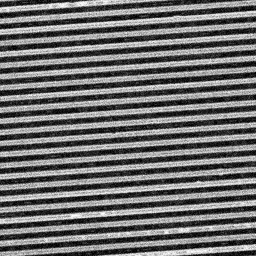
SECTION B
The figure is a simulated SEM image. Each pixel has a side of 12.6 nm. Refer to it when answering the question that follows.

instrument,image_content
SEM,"parallel lines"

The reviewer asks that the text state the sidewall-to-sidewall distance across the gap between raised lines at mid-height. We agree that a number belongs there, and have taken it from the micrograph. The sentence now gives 73.9 nm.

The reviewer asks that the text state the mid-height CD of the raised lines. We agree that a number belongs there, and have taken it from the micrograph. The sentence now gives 0.0613 µm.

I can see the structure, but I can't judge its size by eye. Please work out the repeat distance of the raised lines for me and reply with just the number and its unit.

0.14 µm